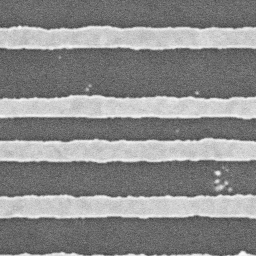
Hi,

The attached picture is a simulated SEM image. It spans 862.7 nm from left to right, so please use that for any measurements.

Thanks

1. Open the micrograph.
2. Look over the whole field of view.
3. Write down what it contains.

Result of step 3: lines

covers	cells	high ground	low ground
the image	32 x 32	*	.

................................
................................
................................
.****.....*****.***.****..*...**
********************************
********************************
................................
................................
................................
................................
................................
................................
********************************
********************************
******************.*********.***
................................
................................
...........**............****...
********************************
********************************
................................
................................
................................
................................
.......*...................*.***
********************************
********************************
................................
................................
................................
................................
................................